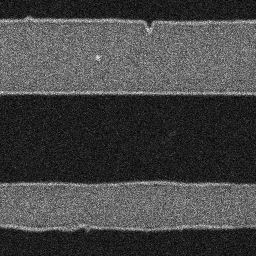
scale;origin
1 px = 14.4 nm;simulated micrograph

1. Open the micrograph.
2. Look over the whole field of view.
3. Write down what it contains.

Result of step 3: one or a few lines or trenches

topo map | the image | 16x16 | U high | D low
UUUUUUUUUUUUUUUU
DDDDDDDDDUDDDDDD
DDDDDDDDDDDDDDDD
DDDDDDDDDDDDDDDD
DDDDDDDDDDDDDDDD
DDDDDDDDDDDDDDDD
UUUUUUUUUUUUUUUU
UUUUUUUUUUUUUUUU
UUUUUUUUUUUUUUUU
UUUUUUUUUUUUUUUU
UUUUUUUUUUUUUUUU
UDUUUUUUDDDUUUUU
DDDDDDDDDDDDDDDD
DDDDDDDDDDDDDDDD
UUUUUUUUUUUUUUUU
UUUUUUUUUUUUUUUU